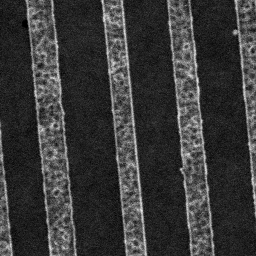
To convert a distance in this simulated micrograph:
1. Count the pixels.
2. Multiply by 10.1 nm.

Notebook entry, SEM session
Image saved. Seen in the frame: one or a few lines or trenches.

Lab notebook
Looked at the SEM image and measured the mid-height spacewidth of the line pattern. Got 456 nm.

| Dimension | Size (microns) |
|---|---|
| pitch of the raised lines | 0.696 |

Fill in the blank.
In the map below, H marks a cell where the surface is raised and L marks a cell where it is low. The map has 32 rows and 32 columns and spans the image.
LLLHHHHLLLLLLHHLLLLLLHHHLLLLLHHH
LLLLHHHLLLLLLHHLLLLLLHHHLLLLLLHH
LLLLHHHLLLLLLHHLLLLLLHHHLLLLLLHH
LLLLHHHLLLLLLHHHLLLLLHHHLLLLLLHH
LLLLHHHLLLLLLHHHLLLLLHHHLLLLLLHH
LLLLHHHLLLLLLHHHLLLLLHHHLLLLLLHH
LLLLHHHLLLLLLHHHLLLLLLHHLLLLLLHH
LLLLHHHLLLLLLLHHLLLLLLHHLLLLLLHH
LLLLHHHLLLLLLLHHLLLLLLHHHLLLLLHH
LLLLHHHLLLLLLLHHLLLLLLHHHLLLLLHH
LLLLHHHHLLLLLLHHLLLLLLHHHLLLLLHH
LLLLHHHHLLLLLLHHLLLLLLHHHLLLLLLH
LLLLLHHHLLLLLLHHLLLLLLHHHLLLLLLH
LLLLLHHHLLLLLLHHLLLLLLHHHLLLLLLH
LLLLLHHHLLLLLLHHHLLLLLHHHLLLLLLH
LLLLLHHHLLLLLLHHHLLLLLHHHLLLLLLH
LLLLLHHHLLLLLLHHHLLLLLHHHLLLLLLH
LLLLLHHHLLLLLLHHHLLLLLLHHLLLLLLH
LLLLLHHHLLLLLLLHHLLLLLLHHLLLLLLH
LLLLLHHHLLLLLLLHHLLLLLLHHHLLLLLH
LLLLLHHHLLLLLLLHHLLLLLLHHHLLLLLH
LLLLLHHHLLLLLLLHHLLLLLLHHHLLLLLH
HLLLLHHHHLLLLLLHHLLLLLLHHHLLLLLL
HLLLLLHHHLLLLLLHHLLLLLLHHHLLLLLL
HLLLLLHHHLLLLLLHHHLLLLLHHHLLLLLL
HLLLLLHHHLLLLLLHHHLLLLLHHHLLLLLL
HLLLLLHHHLLLLLLHHHLLLLLHHHLLLLLL
HLLLLLHHHLLLLLLHHHLLLLLLHHLLLLLL
HLLLLLHHHLLLLLLLHHLLLLLLHHLLLLLL
HLLLLLHHHLLLLLLLHHLLLLLLHHLLLLLL
HLLLLLHHHLLLLLLLHHLLLLLLHHHLLLLL
HLLLLLHHHLLLLLLLHHLLLLLLHHHLLLLL